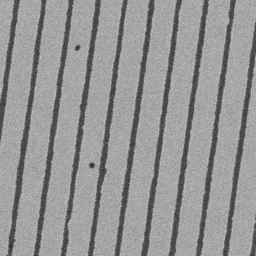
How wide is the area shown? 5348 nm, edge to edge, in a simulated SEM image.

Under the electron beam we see parallel lines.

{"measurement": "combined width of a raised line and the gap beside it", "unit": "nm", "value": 559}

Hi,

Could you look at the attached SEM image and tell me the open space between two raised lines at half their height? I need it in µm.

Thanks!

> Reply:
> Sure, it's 0.127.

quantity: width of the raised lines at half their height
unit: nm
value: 429